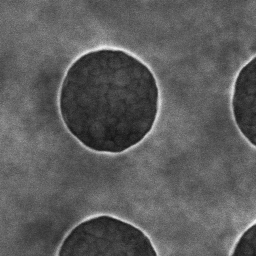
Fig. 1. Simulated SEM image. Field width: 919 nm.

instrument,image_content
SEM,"holes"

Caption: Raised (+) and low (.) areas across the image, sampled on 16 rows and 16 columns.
++++++++++++++++
++++++++++++++++
++++++++++++++++
+++++...++++++++
++++.....++++++.
++++......+++++.
++++......+++++.
++++......+++++.
+++++....++++++.
++++++++++++++++
++++++++++++++++
++++++++++++++++
++++++++++++++++
++++++.+++++++++
++++.....++++++.
++++......+++++.